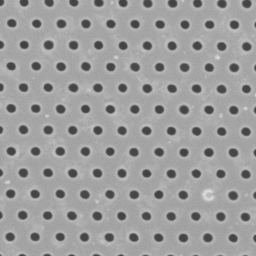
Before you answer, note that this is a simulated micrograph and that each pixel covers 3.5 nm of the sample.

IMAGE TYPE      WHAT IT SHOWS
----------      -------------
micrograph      a regular array of holes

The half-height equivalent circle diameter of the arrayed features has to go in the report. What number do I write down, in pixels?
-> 8.37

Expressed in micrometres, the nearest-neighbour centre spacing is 0.0851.